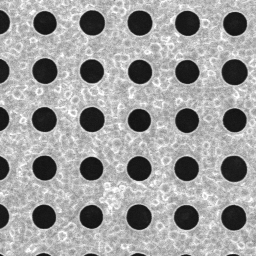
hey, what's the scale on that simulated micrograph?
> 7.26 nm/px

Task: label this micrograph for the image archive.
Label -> a regular array of holes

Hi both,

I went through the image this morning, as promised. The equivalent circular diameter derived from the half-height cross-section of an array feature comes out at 0.18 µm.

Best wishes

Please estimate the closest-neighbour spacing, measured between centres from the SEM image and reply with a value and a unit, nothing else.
344 nm